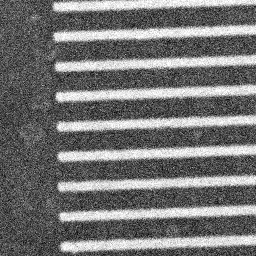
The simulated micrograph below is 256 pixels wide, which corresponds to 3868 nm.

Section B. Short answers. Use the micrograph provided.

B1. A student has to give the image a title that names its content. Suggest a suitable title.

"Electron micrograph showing parallel lines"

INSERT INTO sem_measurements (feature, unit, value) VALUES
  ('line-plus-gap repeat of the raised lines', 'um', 0.453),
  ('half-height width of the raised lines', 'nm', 104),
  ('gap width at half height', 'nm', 357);